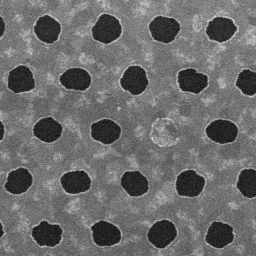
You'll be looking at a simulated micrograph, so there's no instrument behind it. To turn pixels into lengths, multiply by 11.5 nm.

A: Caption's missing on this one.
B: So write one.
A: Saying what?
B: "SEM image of a regular array of holes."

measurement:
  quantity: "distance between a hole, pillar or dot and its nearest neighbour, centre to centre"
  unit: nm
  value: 656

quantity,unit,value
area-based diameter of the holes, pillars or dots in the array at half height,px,28.1